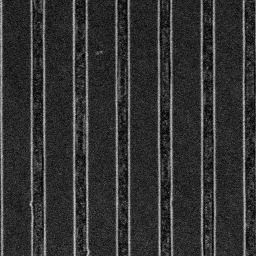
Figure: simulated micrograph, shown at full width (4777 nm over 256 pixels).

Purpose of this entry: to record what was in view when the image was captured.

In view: parallel lines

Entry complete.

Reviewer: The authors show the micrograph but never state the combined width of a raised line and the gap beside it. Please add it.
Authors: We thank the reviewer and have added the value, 794 nm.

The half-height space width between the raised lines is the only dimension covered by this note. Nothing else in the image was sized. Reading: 226 nm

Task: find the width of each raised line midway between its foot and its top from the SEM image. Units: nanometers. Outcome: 569